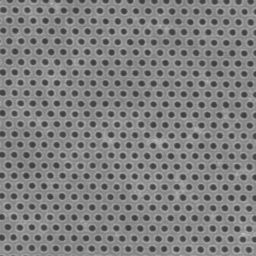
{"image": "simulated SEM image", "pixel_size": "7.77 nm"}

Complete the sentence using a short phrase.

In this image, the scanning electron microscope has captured a regular array of holes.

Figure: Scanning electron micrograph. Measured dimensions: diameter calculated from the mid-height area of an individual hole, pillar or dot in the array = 0.0561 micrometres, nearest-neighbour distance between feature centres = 90.3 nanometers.